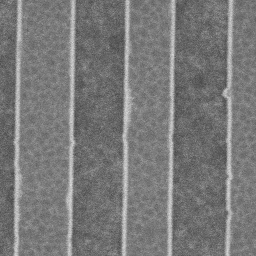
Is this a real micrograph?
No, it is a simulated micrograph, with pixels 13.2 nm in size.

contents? one or a few lines or trenches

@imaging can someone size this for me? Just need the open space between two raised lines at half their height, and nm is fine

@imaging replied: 731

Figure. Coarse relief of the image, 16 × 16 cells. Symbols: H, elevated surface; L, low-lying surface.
LHHHHLLLHHHLLLHH
LHHHHLLLHHHLLLHH
LHHHLLLLHHHLLLHH
LHHHHLLLHHHLLLHH
LHHHHLLLHHHLLLHH
LHHHHLLLHHHLLLHH
LHHHLLLLHHHLLLHH
LHHHLLLLHHHLLLHH
LHHHLLLLHHHLLLHH
LHHHLLLLHHHLLLHH
LHHHLLLLHHHLLLHH
LHHHLLLLHHHLLLHH
LHHHLLLLHHHLLLHH
LHHHLLLLHHHLLLHH
LHHHLLLLHHHLLLHH
LHHHLLLLHHHLLLHH